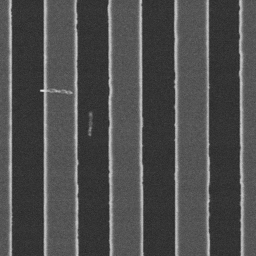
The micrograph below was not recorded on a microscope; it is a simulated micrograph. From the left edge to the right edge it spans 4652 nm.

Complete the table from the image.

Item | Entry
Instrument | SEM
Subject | lines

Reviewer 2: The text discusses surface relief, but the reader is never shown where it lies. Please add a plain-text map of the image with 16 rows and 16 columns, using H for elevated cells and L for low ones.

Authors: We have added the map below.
HLLHHLLHHLLHHLLH
HLLHHLLHHLLHHLLH
HLLHHLLHHLLHHLLH
HLLHHLLHHLLHHLLH
HLLHHLLHHLLHHLLH
HLLHHLLHHLLHHLLH
HLLHHLLHHLLHHLLH
HLLHHLLHHLLHHLLH
HLLHHLLHHLLHHLLH
HLLHHLLHHLLHHLLH
HLLHHLLHHLLHHLLH
HLLHHLLHHLLHHLLH
HLLHHLLHHLLHHLLH
HLLHHLLHHLLHHLLH
HLLHHLLHHLLHHLLH
HLLHHLLHHLLHHLLH